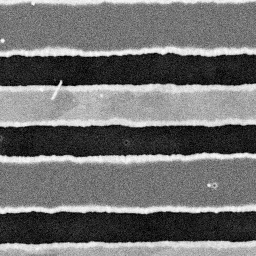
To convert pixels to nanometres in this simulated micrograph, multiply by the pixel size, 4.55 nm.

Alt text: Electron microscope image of lines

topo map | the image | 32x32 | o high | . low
oooooooooooooooooooooooooooooooo
oooooooooooooooooooooooooooooooo
oooooooooooooooooooooooooooooooo
oooooooooooooooooooooooooooooooo
oooooooooooooooooooooooooooooooo
oooooooooooooooooooooooooooooooo
ooooooooooooooooooooo.oooooooooo
................................
................................
................................
................................
oooooooooooooooooooooooooooooooo
oooooooooooooooooooooooooooooooo
oooooooooooooooooooooooooooooooo
oooooooooooooooooooooooooooooooo
oooooooooooooo.ooooooooooooo..o.
................................
................................
................................
..................ooooo.oooooooo
oooooooooooooooooooooooooooooooo
oooooooooooooooooooooooooooooooo
oooooooooooooooooooooooooooooooo
oooooooooooooooooooooooooooooooo
oooooooooooooooooooooooooooooooo
oooooooooooooooooooooooooooooooo
o.....o..........oo.............
................................
................................
................................
........oooooooooooooooooooooooo
oooooooooooooooooooooooooooooooo